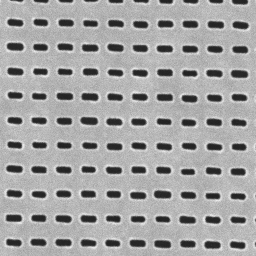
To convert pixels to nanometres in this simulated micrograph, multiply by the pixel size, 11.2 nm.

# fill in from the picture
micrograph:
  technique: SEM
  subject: a regular array of holes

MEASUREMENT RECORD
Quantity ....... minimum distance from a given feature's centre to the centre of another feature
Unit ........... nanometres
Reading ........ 270